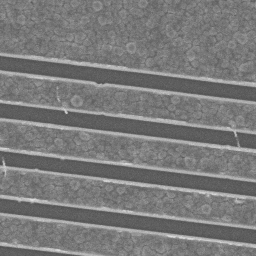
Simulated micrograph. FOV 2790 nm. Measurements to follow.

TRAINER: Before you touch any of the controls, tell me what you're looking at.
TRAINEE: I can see parallel lines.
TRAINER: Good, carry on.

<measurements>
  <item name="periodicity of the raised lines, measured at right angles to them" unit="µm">0.514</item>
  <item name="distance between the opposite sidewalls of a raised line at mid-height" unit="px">31.4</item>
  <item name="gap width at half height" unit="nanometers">181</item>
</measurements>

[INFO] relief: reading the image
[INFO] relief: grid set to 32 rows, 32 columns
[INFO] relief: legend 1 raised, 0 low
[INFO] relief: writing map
11111111111111111111111111111111
11111111111111111111111111111111
11111111111111111111111111111111
11111111111111111111111111111111
11111111111111111111111111111111
11111111111111111111111111111111
11111111111111111111111111111111
00000011111111111111111111111111
00000000000000111111111111111111
11111000000000000000001111111111
11111111111100000000000000000011
11111111111111111111100000000000
11111111111111111111111111110000
00000011111111111111111111111111
00000000000000011111111111111111
11111000000000000000000111111111
11111111111110000000000000000001
11111111111111111111100000000000
11111111111111111111111111111000
00000001111111111111111111111111
00000000000000011111111111111111
11111100000000000000000111111111
11111111111111000000000000000001
11111111111111111111100000000000
11111111111111111111111111111000
00000000111111111111111111111111
00000000000000001111111111111111
11111110000000000000000011111111
11111111111111000000000000000000
11111111111111111111110000000000
11111111111111111111111111111100
00000000111111111111111111111111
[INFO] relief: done